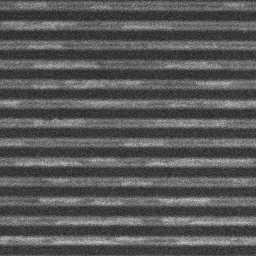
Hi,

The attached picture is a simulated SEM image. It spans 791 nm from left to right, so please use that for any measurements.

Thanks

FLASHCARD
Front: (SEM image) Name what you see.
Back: parallel lines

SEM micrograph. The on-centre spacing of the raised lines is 19.6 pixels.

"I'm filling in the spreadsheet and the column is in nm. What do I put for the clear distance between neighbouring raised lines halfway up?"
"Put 36.7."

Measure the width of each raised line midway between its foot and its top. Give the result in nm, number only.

24.7